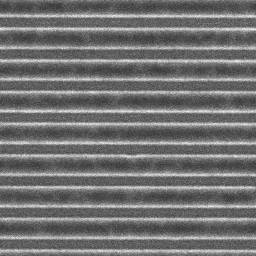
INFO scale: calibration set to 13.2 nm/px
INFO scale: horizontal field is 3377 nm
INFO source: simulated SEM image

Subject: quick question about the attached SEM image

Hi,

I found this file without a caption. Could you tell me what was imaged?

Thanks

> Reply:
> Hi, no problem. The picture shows parallel lines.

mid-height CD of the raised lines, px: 19.6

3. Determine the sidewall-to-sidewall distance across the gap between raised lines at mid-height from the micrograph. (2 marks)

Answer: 148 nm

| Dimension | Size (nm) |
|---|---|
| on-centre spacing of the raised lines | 418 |